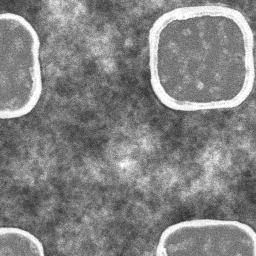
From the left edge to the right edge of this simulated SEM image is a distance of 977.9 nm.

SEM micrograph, raised bodies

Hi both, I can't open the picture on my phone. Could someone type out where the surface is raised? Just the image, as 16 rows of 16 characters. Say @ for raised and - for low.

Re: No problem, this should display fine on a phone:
----------------
@@--------@@@@@-
@@-------@@@@@@@
@@--------@@@@@@
@@-------@@@@@@@
@@--------@@@@@@
@@--------@@@@@-
----------------
----------------
----------------
----------------
----------------
----------------
----------------
@----------@@@@@
@@@-------@@@@@@